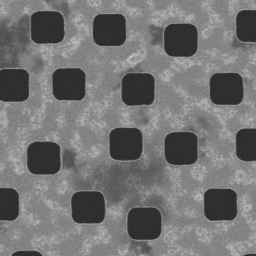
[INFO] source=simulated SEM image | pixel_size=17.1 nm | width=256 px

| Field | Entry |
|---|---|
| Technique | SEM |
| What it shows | a regular array of holes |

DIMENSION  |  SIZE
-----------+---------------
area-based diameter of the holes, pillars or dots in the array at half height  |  0.614 microns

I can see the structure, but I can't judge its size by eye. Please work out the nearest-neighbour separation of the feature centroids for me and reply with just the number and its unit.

1.03 micrometres